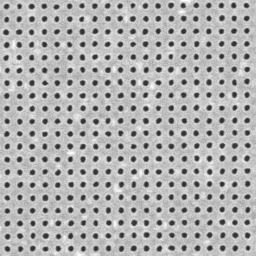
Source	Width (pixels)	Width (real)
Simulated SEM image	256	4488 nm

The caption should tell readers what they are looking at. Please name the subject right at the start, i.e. a regular array of holes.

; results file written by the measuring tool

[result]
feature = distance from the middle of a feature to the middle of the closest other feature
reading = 12.4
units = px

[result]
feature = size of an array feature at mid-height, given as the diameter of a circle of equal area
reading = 110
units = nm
